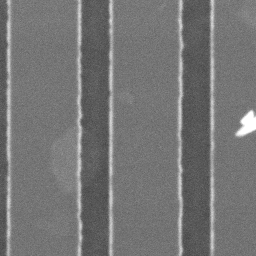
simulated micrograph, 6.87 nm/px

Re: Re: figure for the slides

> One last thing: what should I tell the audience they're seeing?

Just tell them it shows lines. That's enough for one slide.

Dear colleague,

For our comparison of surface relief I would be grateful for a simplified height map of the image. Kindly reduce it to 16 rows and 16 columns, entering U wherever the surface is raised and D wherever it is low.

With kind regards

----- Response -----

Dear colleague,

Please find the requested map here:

DUUUUDDUUUUDDUUU
DUUUUDDUUUUDDUUU
DUUUUDDUUUUDDUUU
DUUUUDDUUUUDDUUU
DUUUUDDUUUUDDUUU
DUUUUDDUUUUDDUUU
DUUUUDDUUUUDDUUU
DUUUUDDUUUUDDUUU
DUUUUDDUUUUDDUUU
DUUUUDDUUUUDDUUU
DUUUUDDUUUUDDUUU
DUUUUDDUUUUDDUUU
DUUUUDDUUUUDDUUU
DUUUUDDUUUUDDUUU
DUUUUDDUUUUDDUUU
DUUUUDDUUUUDDUUU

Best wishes